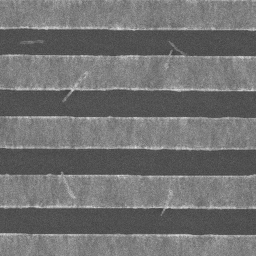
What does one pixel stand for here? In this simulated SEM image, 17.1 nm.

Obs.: lines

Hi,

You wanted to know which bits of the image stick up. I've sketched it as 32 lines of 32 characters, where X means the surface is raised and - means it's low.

XXXXXXXXXXXXXXXXXXXXXXXXXXXXXXXX
XXXXXXXXXXXXXXXXXXXXXXXXXXXXXXXX
XXXXXXXXXXXXXXXXXXXXXXXXXXXXXXXX
X---XXXXXXXXXXXXXXXXXXXXXXXXXXXX
--------------------------------
--------------------------------
--------------------------------
XXXXXXXXXXXXXXXXXXXXXXXXXXXXXXXX
XXXXXXXXXXXXXXXXXXXXXXXXXXXXXXXX
XXXXXXXXXXXXXXXXXXXXXXXXXXXXXXXX
XXXXXXXXXXXXXXXXXXXXXXXXXXXXXXXX
--------------------------------
--------------------------------
--------------------------------
--------------------------------
XXXXXXXXXXXXXXXXXXXXXXXXXXXXXXXX
XXXXXXXXXXXXXXXXXXXXXXXXXXXXXXXX
XXXXXXXXXXXXXXXXXXXXXXXXXXXXXXXX
-XXX-XXXXXXXXXXXXXXXXXXXXXXXXXXX
--------------------------------
--------------------------------
--------------------------------
XXXXXXXXXXXXXXXXXXXXXXXXXXXXXXXX
XXXXXXXXXXXXXXXXXXXXXXXXXXXXXXXX
XXXXXXXXXXXXXXXXXXXXXXXXXXXXXXXX
XXXXXXXXXXXXXXXXXXXXXXXXXXXXXXXX
--------------------------------
--------------------------------
--------------------------------
XXXXXXXXXXXXXXXXXXXXXXXXXXXXXXXX
XXXXXXXXXXXXXXXXXXXXXXXXXXXXXXXX
XXXXXXXXXXXXXXXXXXXXXXXXXXXXXXXX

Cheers